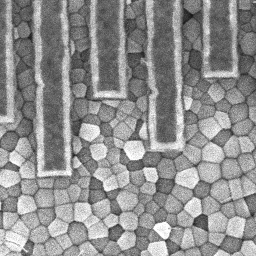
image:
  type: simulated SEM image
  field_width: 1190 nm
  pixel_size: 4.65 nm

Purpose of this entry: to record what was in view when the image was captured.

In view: parallel lines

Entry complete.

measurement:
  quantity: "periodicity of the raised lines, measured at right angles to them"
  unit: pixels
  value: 56.3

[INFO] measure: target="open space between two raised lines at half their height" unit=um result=0.123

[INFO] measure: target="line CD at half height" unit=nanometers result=139